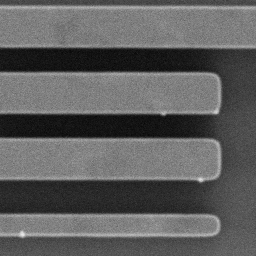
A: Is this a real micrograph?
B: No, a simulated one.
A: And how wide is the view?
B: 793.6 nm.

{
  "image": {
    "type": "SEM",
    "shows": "groups of lines, slits or small figures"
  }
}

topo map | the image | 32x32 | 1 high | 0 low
00000000000000000000000000000000
11111111111111111111111111111111
11111111111111111111111111111111
11111111111111111111111111111111
11111111111111111111111111111111
11111111111111111111111111111111
00000000000000000000000000000000
00000000000000000000000000000000
00000000000000000000000000000000
11111111111111111111111111100000
11111111111111111111111111100000
11111111111111111111111111100000
11111111111111111111111111100000
11111111111111111111111111100000
00000000000000000000000000000000
00000000000000000000000000000000
00000000000000000000000000000000
11111111111111111111111111100000
11111111111111111111111111100000
11111111111111111111111111100000
11111111111111111111111111100000
11111111111111111111111111100000
00000000000000000000000011000000
00000000000000000000000000000000
00000000000000000000000000000000
00000000000000000000000000000000
00000000000000000000000000000000
11111111111111111111111111100000
11111111111111111111111111100000
00000000000000000000000000000000
00000000000000000000000000000000
00000000000000000000000000000000